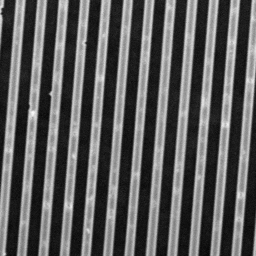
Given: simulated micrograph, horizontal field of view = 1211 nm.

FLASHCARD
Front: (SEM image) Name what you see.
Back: parallel lines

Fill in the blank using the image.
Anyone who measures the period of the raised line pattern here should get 21.4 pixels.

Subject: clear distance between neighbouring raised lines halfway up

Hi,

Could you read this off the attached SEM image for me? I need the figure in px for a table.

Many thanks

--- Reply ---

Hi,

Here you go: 12.3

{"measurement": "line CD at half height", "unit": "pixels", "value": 8.86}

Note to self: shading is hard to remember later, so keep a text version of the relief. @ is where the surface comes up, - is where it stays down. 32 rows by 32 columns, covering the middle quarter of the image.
---@@---@@----@@---@@---@@@---@@
---@@---@@----@@---@@---@@----@@
---@@---@@----@@---@@---@@----@@
---@@---@@---@@----@@---@@----@@
---@@---@@---@@----@@---@@---@@-
--@@----@@---@@----@@---@@---@@-
--@@----@@---@@---@@@---@@---@@-
--@@----@@---@@---@@----@@---@@-
--@@----@@---@@---@@----@@---@@-
--@@---@@----@@---@@----@@---@@-
--@@---@@----@@---@@----@@---@@-
--@@---@@----@@---@@----@@---@@-
--@@---@@----@@---@@----@@---@@-
--@@---@@----@@---@@---@@----@@-
--@@---@@----@@---@@---@@----@@-
--@@---@@---@@----@@---@@----@@-
--@@---@@---@@----@@---@@----@@-
--@@---@@---@@----@@---@@---@@--
-@@----@@---@@----@@---@@---@@--
-@@----@@---@@----@----@@---@@--
-@@----@@---@@----@----@@---@@--
-@@----@@---@@----@----@@---@@--
-@@----@----@@---@@----@@---@@--
-@@---@@----@@---@@----@@---@@--
-@@---@@----@@---@@----@@---@@--
-@@---@@----@@---@@---@@@---@@--
-@@---@@----@@---@@---@@----@@--
-@@---@@----@@---@@---@@----@@--
-@@---@@---@@----@@---@@----@@--
-@@---@@---@@----@@---@@---@@---
@@----@@---@@----@@---@@---@@---
@@----@@---@@---@@@---@@---@@---